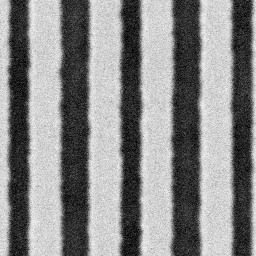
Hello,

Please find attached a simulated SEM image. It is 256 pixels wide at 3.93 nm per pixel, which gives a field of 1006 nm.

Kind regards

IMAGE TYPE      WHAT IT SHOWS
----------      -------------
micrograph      lines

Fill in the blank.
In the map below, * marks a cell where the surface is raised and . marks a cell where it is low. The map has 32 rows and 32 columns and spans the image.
*...***....****...***....****...
*...****...****...***....****...
*...****...****...***....****...
*...***....****...***....****...
*...****...****...***....****...
*...****...****...****...****...
*...****...****...***....****...
*...****...****...***....****...
*...***....****...***....****...
*...***....****...***....****...
*...****...****...***....****...
*...****...****...***....****...
*...****...****...***....****...
*...***....****...***....****...
*...***....****...***....****...
*...****...****...***....****...
*...****...****...***....****...
*...***....****...***....****...
*...****...****...***....****...
*...***....****...***....****...
*...***....****...***....****...
*...****...****...***....****...
*...****...****...***....****...
*...***....****...***....****...
*...***....****...***....****...
*...****...****...***....****...
*...****...****...***....****...
*...****...****...***....****...
*...****...****...***....****...
*...****...****...***....****...
*...****...****...***....****...
*...****...****...***....****...